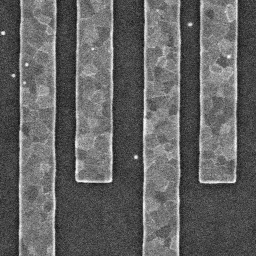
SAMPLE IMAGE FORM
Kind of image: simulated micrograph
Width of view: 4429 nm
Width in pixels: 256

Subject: wiring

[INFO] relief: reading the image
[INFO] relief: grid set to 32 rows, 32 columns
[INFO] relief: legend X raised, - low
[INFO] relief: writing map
---XXXX---XXXX----XXXX---XXXXX--
---XXXX---XXXX----XXXX---XXXXX--
---XXXX---XXXX----XXXX---XXXXX--
---XXXX---XXXX----XXXX---XXXXX--
---XXXX---XXXX----XXXX---XXXXX--
---XXXX---XXXX----XXXX---XXXXX--
---XXXX---XXXX----XXXX---XXXXX--
--XXXXX---XXXX----XXXX---XXXXX--
--XXXXX---XXXX----XXXX---XXXXX--
---XXXX---XXXX----XXXX---XXXXX--
---XXXX---XXXX----XXXX---XXXXX--
---XXXX---XXXX----XXXX---XXXXX--
---XXXX---XXXX----XXXX---XXXXX--
---XXXX---XXXX----XXXX---XXXX---
---XXXX---XXXX----XXXX---XXXX---
---XXXX---XXXX----XXXX---XXXX---
--XXXXX---XXXX----XXXX---XXXX---
--XXXXX--XXXXX----XXXX---XXXX---
--XXXXX--XXXXX----XXXX---XXXX---
--XXXXX--XXXXX----XXXX---XXXX---
--XXXXX---XXXX----XXXX---XXXX---
--XXXXX--XXXXX----XXXX---XXXX---
--XXXXX---XXXX----XXXX---XXXX---
--XXXXX-----------XXXX----------
--XXXXX-----------XXXX----------
--XXXXX-----------XXXX----------
--XXXXX-----------XXXX----------
--XXXXX-----------XXXX----------
--XXXXX-----------XXXX----------
--XXXXX-----------XXXX----------
--XXXXX-----------XXXX----------
--XXXXX-----------XXXX----------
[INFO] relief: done